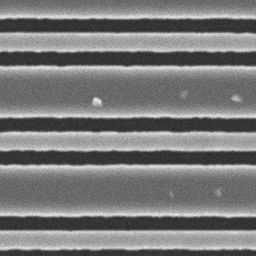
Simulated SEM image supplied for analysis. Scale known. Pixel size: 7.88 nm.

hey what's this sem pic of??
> lines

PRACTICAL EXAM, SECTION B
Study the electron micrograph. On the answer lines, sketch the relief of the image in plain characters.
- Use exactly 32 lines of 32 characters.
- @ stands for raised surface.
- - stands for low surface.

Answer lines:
@@@@@@@@@@@@@@@@@@@@@@@@@@@@@@@@
@@@@@@@@@@@@@@@@@@@@@@@@@@@@@@@@
--------------------------------
--------------------------------
@@@@@@@@@@@@@@@@@@@@@@@@@@@@@@@@
@@@@@@@@@@@@@@@@@@@@@@@@@@@@@@@@
--------------------------------
--------------------------------
@@@@@@@@@@@@@@@@@@@@@@@@@@@@@@@@
@@@@@@@@@@@@@@@@@@@@@@@@@@@@@@@@
@@@@@@@@@@@@@@@@@@@@@@@@@@@@@@@@
@@@@@@@@@@@@@@@@@@@@@@@@@@@@@@@@
@@@@@@@@@@@@@@@@@@@@@@@@@@@@@@@@
@@@@@@@@@@@@@@@@@@@@@@@@@@@@@@@@
@@@@@@@@@@@@@@@@@@@@@@@@@@@@@@@@
--------------------------------
--------------------------------
@@@@@@@@@@@@@@@@@@@@@@@@@@@@@@@@
@@@@@@@@@@@@@@@@@@@@@@@@@@@@@@@@
--------------------------------
--------------------------------
@@@@@@@@@@@@@@@@@@@@@@@@@@@@@@@@
@@@@@@@@@@@@@@@@@@@@@@@@@@@@@@@@
@@@@@@@@@@@@@@@@@@@@@@@@@@@@@@@@
@@@@@@@@@@@@@@@@@@@@@@@@@@@@@@@@
@@@@@@@@@@@@@@@@@@@@@@@@@@@@@@@@
@@@@@@@@@@@@@@@@@@@@@@@@@@@@@@@@
--------------------------------
--------------------------------
@@@@@@@@@@@@@@@@@@@@@@@@@@@@@@@@
@@@@@@@@@@@@@@@@@@@@@@@@@@@@@@@@
--------------------------------